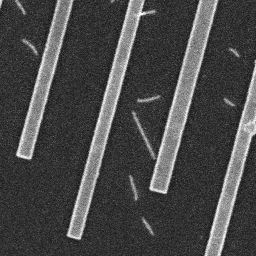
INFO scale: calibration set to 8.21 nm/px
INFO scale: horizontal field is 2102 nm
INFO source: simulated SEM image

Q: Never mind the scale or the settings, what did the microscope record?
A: one or a few lines or trenches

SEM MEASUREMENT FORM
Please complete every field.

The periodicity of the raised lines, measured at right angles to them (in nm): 568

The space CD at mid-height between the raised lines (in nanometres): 446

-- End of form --